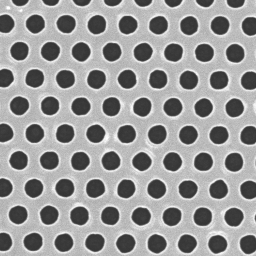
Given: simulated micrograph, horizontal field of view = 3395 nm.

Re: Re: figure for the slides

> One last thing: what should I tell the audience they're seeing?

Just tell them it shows a regular array of holes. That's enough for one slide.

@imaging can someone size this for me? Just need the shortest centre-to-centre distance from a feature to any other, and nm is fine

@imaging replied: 407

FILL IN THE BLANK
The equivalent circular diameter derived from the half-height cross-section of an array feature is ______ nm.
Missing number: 246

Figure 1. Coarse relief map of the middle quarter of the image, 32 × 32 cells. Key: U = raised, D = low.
UUUUUUUUUUUUUUUUUUUUUUUUUUUUUUUU
UUUUUUUDUUUUUUUDDUUUUUUUUUUUUUUU
DDUUUUDDDDUUUUDDDDUUUUDDDUUUUDDD
DDDUUUDDDDUUUDDDDDUUUDDDDDUUUDDD
DDDUUUDDDDUUUUDDDDUUUDDDDDUUUDDD
DDUUUUDDDDUUUUDDDUUUUUDDDUUUUDDD
UUUUUUUUUUUUUUUUUUUUUUUUUUUUUUUD
UUUUUUUUUUUUUUUUUUUUUUUUUUUUUUUU
UUUUDUUUUUUDDUUUUUUDDUUUUUUDUUUU
UUDDDDUUUUDDDDUUUUDDDDUUUDDDDUUU
UUDDDDDUUUDDDDUUUDDDDDUUUDDDDDUU
UUDDDDUUUUDDDDUUUDDDDDUUUDDDDDUU
UUUDDDUUUUDDDUUUUUDDDUUUUUDDDUUU
UUUUUUUUUUUUUUUUUUUUUUUUUUUUUUUU
UUUUUUUUUUUUUUUUUUUUUUUUUUUUUUUU
DDUUUUUDDUUUUUUDDUUUUUUDDUUUUUUD
DDUUUUDDDDUUUUDDDDUUUDDDDUUUUDDD
DDDUUUDDDDUUUDDDDDUUUDDDDDUUUDDD
DDUUUUDDDDUUUUDDDDUUUDDDDDUUUDDD
DDUUUUUDDUUUUUDDDUUUUUDDDUUUUUDD
UUUUUUUUUUUUUUUUUUUUUUUUUUUUUUUU
UUUUUUUUUUUUUUUUUUUUUUUUUUUUUUUU
UUUDDDUUUUDDDUUUUUDDDUUUUUDDDUUU
UUDDDDUUUUDDDDUUUDDDDDUUUDDDDUUU
UUDDDDUUUDDDDDUUUDDDDDUUUDDDDUUU
UUDDDDUUUUDDDDUUUDDDDUUUUDDDDUUU
UUUDDUUUUUUDUUUUUUUDUUUUUUDDUUUU
UUUUUUUUUUUUUUUUUUUUUUUUUUUUUUUU
UUUUUUUUUUUUUUUUUUUUUUUUUUUUUUUU
DDUUUUDDDDUUUUDDDUUUUUDDUUUUUUDD
DDUUUUDDDDUUUDDDDDUUUDDDDUUUUDDD
DDDUUDDDDDUUUDDDDDUUUDDDDDUUUDDD